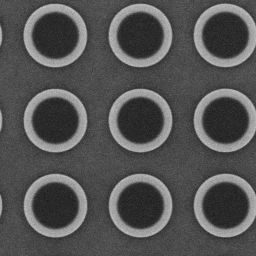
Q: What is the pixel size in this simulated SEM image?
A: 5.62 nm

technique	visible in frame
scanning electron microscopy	an array of small figures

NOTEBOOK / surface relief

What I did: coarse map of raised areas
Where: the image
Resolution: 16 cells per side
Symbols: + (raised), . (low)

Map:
...+....++...++.
..+++..++++.++++
..+++..++++.++++
..+++..+++...+++
................
................
..+++..+++..++++
..+++..++++.++++
..+++..+++..++++
................
................
..+++..+++...+++
..+++..++++.++++
..+++..++++.++++
..+++...++...++.
................